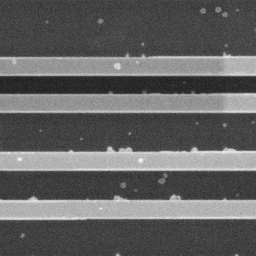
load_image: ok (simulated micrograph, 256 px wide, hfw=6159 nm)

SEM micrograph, lines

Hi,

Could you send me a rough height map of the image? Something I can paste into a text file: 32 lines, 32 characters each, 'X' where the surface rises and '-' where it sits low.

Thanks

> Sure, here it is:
--------------------------------
--------------------------------
--------------------------------
--------------------------------
--------------------------------
--------------------------------
--------------------------------
XXXXXXXXXXXXXXXXXXXXXXXXXXXXXXXX
XXXXXXXXXXXXXXXXXXXXXXXXXXXXXXXX
--------------------------------
--------------------------------
--------------------------------
XXXXXXXXXXXXXXXXXXXXXXXXXXXXXXXX
XXXXXXXXXXXXXXXXXXXXXXXXXXXXXXXX
--------------------------------
--------------------------------
--------------------------------
--------------------------------
--------------------------------
XXXXXXXXXXXXXXXXXXXXXXXXXXXXXXXX
XXXXXXXXXXXXXXXXXXXXXXXXXXXXXXXX
--------------------------------
--------------------------------
--------------------------------
--------------------------------
XXXXXXXXXXXXXXXXXXXXXXXXXXXXXXXX
XXXXXXXXXXXXXXXXXXXXXXXXXXXXXXXX
--------------------------------
--------------------------------
--------------------------------
--------------------------------
--------------------------------